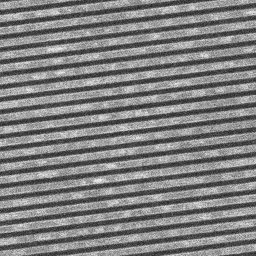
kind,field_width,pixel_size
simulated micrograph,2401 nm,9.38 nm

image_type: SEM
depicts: parallel lines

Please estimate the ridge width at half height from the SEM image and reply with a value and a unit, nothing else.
65.2 nm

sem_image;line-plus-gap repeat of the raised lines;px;12.3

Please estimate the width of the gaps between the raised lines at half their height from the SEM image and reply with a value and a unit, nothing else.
48.8 nanometers